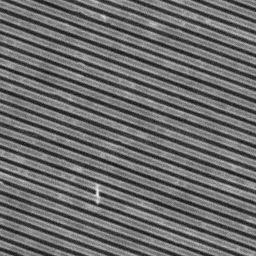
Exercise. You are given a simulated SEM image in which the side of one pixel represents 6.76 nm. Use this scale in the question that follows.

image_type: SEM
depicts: parallel lines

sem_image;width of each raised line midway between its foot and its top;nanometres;38.9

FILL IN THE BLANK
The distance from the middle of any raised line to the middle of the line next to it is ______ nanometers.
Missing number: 72.6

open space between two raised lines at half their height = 32.6 nanometres